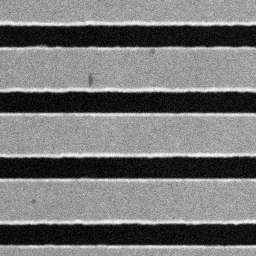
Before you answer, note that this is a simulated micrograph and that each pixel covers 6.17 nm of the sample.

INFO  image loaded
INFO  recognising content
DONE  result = lines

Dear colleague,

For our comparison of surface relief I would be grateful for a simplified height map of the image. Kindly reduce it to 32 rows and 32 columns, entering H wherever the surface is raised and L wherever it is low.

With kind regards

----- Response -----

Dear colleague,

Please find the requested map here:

HHHHHHHHHHHHHHHHHHHHHHHHHHHHHHHH
HHHHHHHHHHHHHHHHHHHHHHHHHHHHHHHH
HHHHHHHHHHHHHHHHHHHHHHHHHHHHHHHH
LLLLLLLLLLLLLLLLLLLLLLLLLLLLLLLL
LLLLLLLLLLLLLLLLLLLLLLLLLLLLLLLL
LLLLLLLLLLLLLLLLLLLLLLLLLLLLLLLL
HHHHHHHHHHHHHHHHHHHHHHHHHHHHHHHH
HHHHHHHHHHHHHHHHHHHHHHHHHHHHHHHH
HHHHHHHHHHHHHHHHHHHHHHHHHHHHHHHH
HHHHHHHHHHHHHHHHHHHHHHHHHHHHHHHH
HHHHHHHHHHHHHHHHHHHHHHHHHHHHHHHH
LLLLLLLLLLLLLLLLLLLLLLLLLLLLLLLL
LLLLLLLLLLLLLLLLLLLLLLLLLLLLLLLL
LLLLLLLLLLLLLLLLLLLLLLLLLLLLLLLL
HHHHHHHHHHHHHHHHHHHHHHHHHHHHHHHH
HHHHHHHHHHHHHHHHHHHHHHHHHHHHHHHH
HHHHHHHHHHHHHHHHHHHHHHHHHHHHHHHH
HHHHHHHHHHHHHHHHHHHHHHHHHHHHHHHH
HHHHHHHHHHHHHHHHHHHHHHHHHHHHHHHH
HHHHHHHHHHHHHHHHHHHHHHLHHHHHHLLL
LLLLLLLLLLLLLLLLLLLLLLLLLLLLLLLL
LLLLLLLLLLLLLLLLLLLLLLLLLLLLLLLL
HHHHHHHHHHHHHHHHHHHHHHHHHHHHHHHH
HHHHHHHHHHHHHHHHHHHHHHHHHHHHHHHH
HHHHHHHHHHHHHHHHHHHHHHHHHHHHHHHH
HHHHHHHHHHHHHHHHHHHHHHHHHHHHHHHH
HHHHHHHHHHHHHHHHHHHHHHHHHHHHHHHH
HHHHHHHHHHHHHHHHHHHHHHHHHHHHHHHH
LLLLLLLLLLLLLLLLLLLLLLLLLLLLLLLL
LLLLLLLLLLLLLLLLLLLLLLLLLLLLLLLL
LLLLLLLLLLLLLLLLLLLLLLLLLLLLLLLL
HHHHHHHHHHHHHHHHHHHHHHHHHHHHHHHH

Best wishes